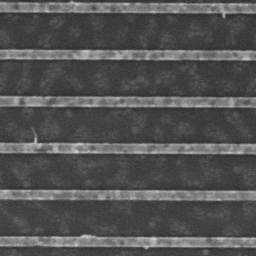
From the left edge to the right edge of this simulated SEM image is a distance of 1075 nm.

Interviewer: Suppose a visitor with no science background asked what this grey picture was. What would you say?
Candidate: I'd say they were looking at parallel lines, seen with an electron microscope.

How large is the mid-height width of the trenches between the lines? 158 nm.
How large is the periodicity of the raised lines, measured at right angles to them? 196 nanometers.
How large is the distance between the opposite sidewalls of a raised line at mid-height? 8.86 px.